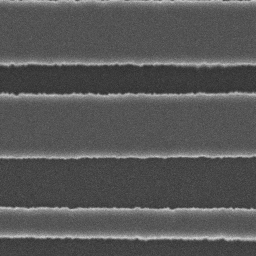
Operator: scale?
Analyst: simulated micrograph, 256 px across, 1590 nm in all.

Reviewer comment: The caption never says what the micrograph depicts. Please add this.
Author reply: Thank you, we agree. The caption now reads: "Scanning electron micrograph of lines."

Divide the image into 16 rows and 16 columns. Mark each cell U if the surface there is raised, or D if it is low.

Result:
UUUUUUUUUUUUUUUU
UUUUUUUUUUUUUUUU
UUUUUUUUUUUUUUUU
UUUUUUUUUUUUUUUU
DDDDDDDDDDDDDDDD
DDDDDDDDDDDDDDDD
UUUUUUUUUUUUUUUU
UUUUUUUUUUUUUUUU
UUUUUUUUUUUUUUUU
UUUUUUUUUUUUUUUU
DDDDDDDDDDDDDDDD
DDDDDDDDDDDDDDDD
DDDDDDDDDDDDDDDD
UUUUUUUUUUUUUUUU
UUUUUUUUUUUUUUUU
DDDDDDDDDDDDDDDD